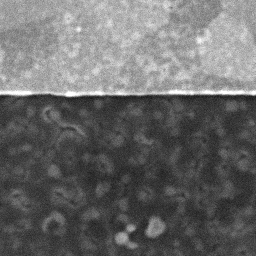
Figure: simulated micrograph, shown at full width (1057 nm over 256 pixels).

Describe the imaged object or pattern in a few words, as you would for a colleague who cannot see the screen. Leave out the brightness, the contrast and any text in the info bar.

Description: one or a few lines or trenches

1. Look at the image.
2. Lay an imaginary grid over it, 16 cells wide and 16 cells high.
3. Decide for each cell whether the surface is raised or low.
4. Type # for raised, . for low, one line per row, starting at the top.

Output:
################
################
################
################
################
################
................
................
................
................
................
................
................
................
.........#......
................